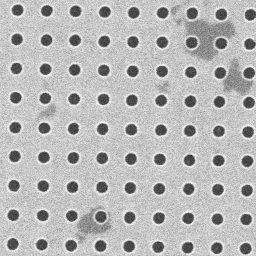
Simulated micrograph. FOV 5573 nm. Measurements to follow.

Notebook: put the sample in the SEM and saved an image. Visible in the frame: a regular array of holes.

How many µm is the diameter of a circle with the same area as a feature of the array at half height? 0.267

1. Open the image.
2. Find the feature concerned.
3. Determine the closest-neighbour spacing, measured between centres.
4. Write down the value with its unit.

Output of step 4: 628 nm